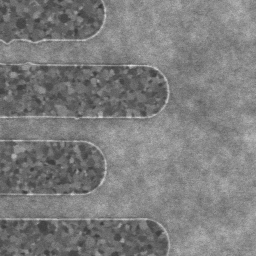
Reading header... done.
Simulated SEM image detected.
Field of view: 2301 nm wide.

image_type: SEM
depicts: one or a few lines or trenches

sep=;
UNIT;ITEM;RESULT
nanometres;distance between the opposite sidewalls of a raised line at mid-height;478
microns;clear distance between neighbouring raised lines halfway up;0.219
